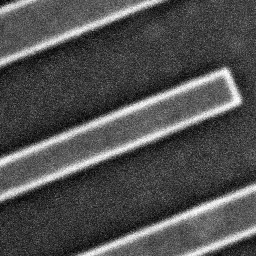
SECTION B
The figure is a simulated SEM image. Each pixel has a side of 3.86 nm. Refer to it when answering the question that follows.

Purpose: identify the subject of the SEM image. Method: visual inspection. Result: one or a few lines or trenches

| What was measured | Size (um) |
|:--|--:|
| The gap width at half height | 0.351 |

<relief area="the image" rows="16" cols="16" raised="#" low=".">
#########.......
######..........
####............
#...............
................
...........####.
.........#####..
......######....
....######......
..#####.........
#####...........
##..............
..............##
............####
.........#######
.......######...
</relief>